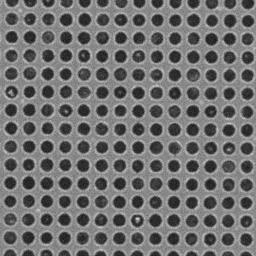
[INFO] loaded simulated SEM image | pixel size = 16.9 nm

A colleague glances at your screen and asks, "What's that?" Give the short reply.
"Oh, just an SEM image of a regular array of holes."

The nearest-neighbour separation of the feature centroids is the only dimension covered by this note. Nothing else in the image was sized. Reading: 305 nm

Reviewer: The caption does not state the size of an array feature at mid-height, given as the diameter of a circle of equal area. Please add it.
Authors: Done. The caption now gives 236 nm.